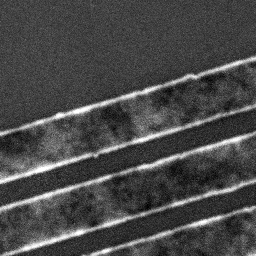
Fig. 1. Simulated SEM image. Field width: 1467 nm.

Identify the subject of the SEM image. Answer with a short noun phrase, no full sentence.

one or a few lines or trenches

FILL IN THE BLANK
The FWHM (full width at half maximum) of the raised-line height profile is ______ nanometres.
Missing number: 266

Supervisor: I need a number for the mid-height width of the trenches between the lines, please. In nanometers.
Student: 144